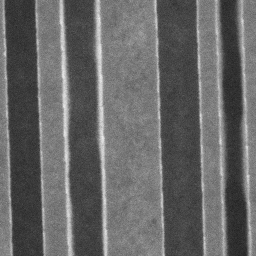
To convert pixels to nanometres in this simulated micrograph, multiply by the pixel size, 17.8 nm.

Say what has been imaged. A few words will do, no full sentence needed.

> lines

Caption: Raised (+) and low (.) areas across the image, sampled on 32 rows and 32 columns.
.....+++....+++++++......++...++
.....+++....+++++++......++...++
.....+++....+++++++......++...++
+....+++.....+++++++.....++...++
+....+++.....+++++++.....++...++
+....+++.....+++++++.....++...++
+....+++.....+++++++.....++...++
+....+++.....+++++++.....++....+
+....+++.....+++++++.....++....+
+....+++.....+++++++.....++....+
+....+++.....+++++++.....++....+
+....+++.....+++++++.....++....+
+....+++.....+++++++.....++....+
+....+++.....+++++++.....++....+
+....+++.....+++++++.....++....+
+....+++.....+++++++.....++....+
+....+++.....+++++++.....++....+
+....+++.....+++++++.....+++...+
+....+++.....+++++++.....+++...+
+....+++.....+++++++.....+++...+
+....+++.....+++++++.....+++...+
+....+++.....+++++++.....+++...+
+....+++.....+++++++.....+++...+
+....+++.....+++++++.....+++...+
+....+++.....+++++++.....+++...+
+....+++.....+++++++.....+++...+
+....+++.....+++++++.....+++...+
+....+++.....+++++++......++...+
+....+++.....+++++++......++...+
+....++++....+++++++......++...+
+.....+++....+++++++......++...+
+.....+++....+++++++......++...+